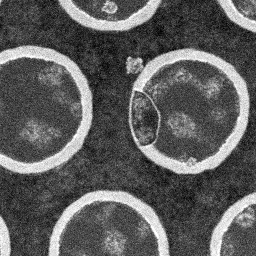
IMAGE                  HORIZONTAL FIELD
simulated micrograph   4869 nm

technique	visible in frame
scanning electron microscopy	raised bodies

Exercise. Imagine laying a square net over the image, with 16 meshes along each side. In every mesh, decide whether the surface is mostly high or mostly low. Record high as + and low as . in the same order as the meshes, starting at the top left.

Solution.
....+++++.....++
......++.......+
................
+++........++...
+++++....+++++..
+++++....++++++.
+++++.....+++++.
+++++.....+++++.
+++++.....+++++.
++++.....+++++..
................
................
.....+++........
....+++++.....++
....++++++....++
...+++++++...+++